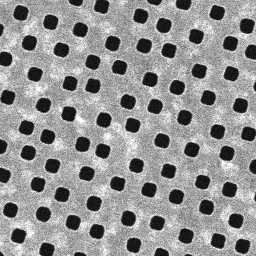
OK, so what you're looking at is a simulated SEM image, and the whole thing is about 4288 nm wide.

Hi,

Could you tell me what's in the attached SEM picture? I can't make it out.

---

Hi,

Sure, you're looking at a regular array of holes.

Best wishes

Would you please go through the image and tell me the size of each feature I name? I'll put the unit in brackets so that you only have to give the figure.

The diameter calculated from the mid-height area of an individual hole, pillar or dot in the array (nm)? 260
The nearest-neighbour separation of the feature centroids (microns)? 0.451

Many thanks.